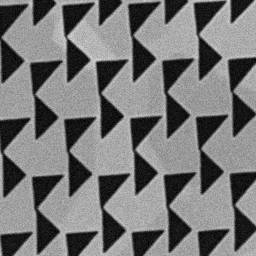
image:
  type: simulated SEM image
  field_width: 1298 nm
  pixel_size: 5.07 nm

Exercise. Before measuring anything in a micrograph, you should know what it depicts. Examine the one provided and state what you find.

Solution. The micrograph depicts an array of small figures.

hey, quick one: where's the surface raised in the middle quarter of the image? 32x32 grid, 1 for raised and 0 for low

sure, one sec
00000111000000011000001100000001
10001111000000111000011100000011
10011111000001111000111110000011
10011111000001111001111110000111
10111111000011111011111110001111
11111111000111111111111110011111
11111111001111111111111110111111
11111111001111111111111110111111
11111111100111111111111110011111
11111111100011111111111110000111
11111111100001111111111110000011
11111111100000111111111110000001
11111111100000011111111110000000
10000000100000011000000000000001
00000001100000110000000010000011
00000001100001110000000110000111
00000011100011110000001110001111
00000111100111111000011110011111
00001111101111111000111111111111
00011111111111111000111111111111
00111111111111111001111111111111
00111111111111111011111111111111
10111111111111111001111111111111
10011111111111111000111111111111
10001111111111111000011111111111
10000111111111111000001111111111
10000011111111111000000111111111
10000001111110000000000110000000
10000011000000001000000110000000
10000111000000011100001110000001
10001111000000111100011110000001
10011111100000111100111110000011